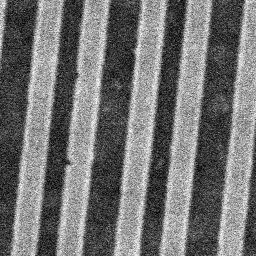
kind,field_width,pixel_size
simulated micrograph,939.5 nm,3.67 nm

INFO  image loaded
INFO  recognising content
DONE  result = parallel lines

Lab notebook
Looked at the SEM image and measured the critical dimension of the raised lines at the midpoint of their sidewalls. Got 76.7 nm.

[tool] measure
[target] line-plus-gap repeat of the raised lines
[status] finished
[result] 0.185 µm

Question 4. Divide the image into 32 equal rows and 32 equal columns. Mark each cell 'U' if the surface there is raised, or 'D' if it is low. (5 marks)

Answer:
UDDDDUUUDDDUUDDDDDUUDDDDUUDDDDDU
DDDDDUUUDDDUUDDDDDUUDDDDUUDDDDDU
DDDDDUUDDDDUUDDDDDUUDDDUUUDDDDDU
DDDDDUUDDDUUUDDDDDUUDDDUUUDDDDUU
DDDDDUUDDDUUUDDDDUUUDDDUUUDDDDUU
DDDDDUUDDDUUUDDDDUUUDDDUUUDDDDUU
DDDDUUUDDDUUUDDDDUUUDDDUUUDDDDUU
DDDDUUUDDDUUUDDDDUUUDDDUUDDDDDUU
DDDDUUUDDDUUDDDDDUUUDDDUUDDDDDUU
DDDDUUUDDDUUDDDDDUUUDDDUUDDDDDUU
DDDDUUUDDDUUDDDDDUUUDDDUUDDDDDUU
DDDDUUDDDDUUDDDDDUUDDDUUUDDDDDUU
DDDDUUDDDUUUDDDDDUUDDDUUUDDDDUUU
DDDDUUDDDUUUDDDDDUUDDDUUUDDDDUUU
DDDDUUDDDUUUDDDDUUUDDDUUUDDDDUUU
DDDUUUDDDUUUDDDDUUUDDDUUUDDDDUUU
DDDUUUDDDUUUDDDDUUUDDDUUDDDDDUUU
DDDUUUDDDUUUDDDDUUUDDDUUDDDDDUUU
DDDUUUDDDUUDDDDDUUUDDDUUDDDDDUUD
DDDUUUDDDUUDDDDDUUUDDDUUDDDDDUUD
DDDUUDDDDUUDDDDDUUDDDUUUDDDDDUUD
DDDUUDDDUUUDDDDDUUDDDUUUDDDDUUUD
DDDUUDDDUUUDDDDDUUDDDUUUDDDDUUUD
DDDUUDDDUUUDDDDUUUDDDUUUDDDDUUUD
DDUUUDDDUUUDDDDUUUDDDUUUDDDDUUUD
DDUUUDDDUUUDDDDUUUDDDUUDDDDDUUUD
DDUUUDDDUUUDDDDUUUDDDUUDDDDDUUUD
DDUUUDDDUUDDDDDUUUDDDUUDDDDDUUUD
DDUUUDDDUUDDDDDUUDDDDUUDDDDDUUDD
DDUUUDDDUUDDDDDUUDDDUUUDDDDDUUDD
DDUUDDDUUUDDDDDUUDDDUUUDDDDDUUDD
DDUUDDDUUUDDDDDUUDDDUUUDDDDUUUDD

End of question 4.